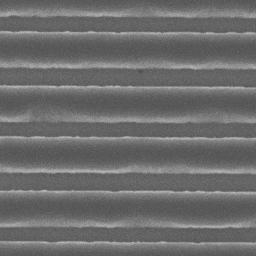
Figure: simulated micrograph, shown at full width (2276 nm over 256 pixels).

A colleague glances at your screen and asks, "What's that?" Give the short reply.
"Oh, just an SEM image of lines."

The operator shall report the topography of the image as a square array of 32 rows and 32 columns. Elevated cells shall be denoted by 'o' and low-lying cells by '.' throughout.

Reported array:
oooooooooooooooooooooooooooooooo
oooooooooooooooooooooooooooooooo
................................
................................
oooooooooooooooooooooooooooooooo
oooooooooooooooooooooooooooooooo
oooooooooooooooooooooooooooooooo
oooooooooooooooooooooooooooooooo
................................
................................
................................
oooooooooooooooooooooooooooooooo
oooooooooooooooooooooooooooooooo
oooooooooooooooooooooooooooooooo
oooooooooooooooooooooooooooooooo
................................
................................
oooooooooooooooooooooooooooooooo
oooooooooooooooooooooooooooooooo
oooooooooooooooooooooooooooooooo
oooooooooooooooooooooooooooooooo
................................
................................
................................
oooooooooooooooooooooooooooooooo
oooooooooooooooooooooooooooooooo
oooooooooooooooooooooooooooooooo
oooooooooooooooooooooooooooooooo
................................
................................
oooooooooooooooooooooooooooooooo
oooooooooooooooooooooooooooooooo